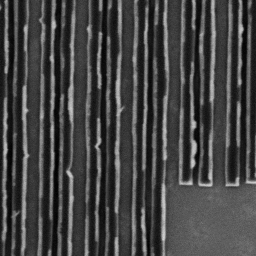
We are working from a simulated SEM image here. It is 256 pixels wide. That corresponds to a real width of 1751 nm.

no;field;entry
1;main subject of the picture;parallel lines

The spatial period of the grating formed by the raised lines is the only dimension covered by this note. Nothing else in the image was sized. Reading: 161 nanometres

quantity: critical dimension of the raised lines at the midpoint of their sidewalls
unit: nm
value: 88.9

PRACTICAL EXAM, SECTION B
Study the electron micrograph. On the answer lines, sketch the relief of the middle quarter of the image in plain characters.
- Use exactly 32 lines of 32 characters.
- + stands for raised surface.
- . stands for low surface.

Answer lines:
++....+++..+++...++++.++++....++
++....+++..+++....+++..+++....++
++....+++..+++....+++..+++...+++
++....+++..+++...++++..+++...+++
++....+++..+++....+++..+++...+++
++....+++..+++....+++..+++...+++
++....+++..+++....+++..+++...+++
++....+++..+++....+++..+++...+++
++....+++..+++....+++..+++...+++
++....+++..+++....+++.+++....+++
++....+++..+++....+++.+++....+++
++....+++..+++....+++..++....+++
++....+++..+++...+++...++....+++
++....+++..+++...+++...++....+++
++....+++..+++...+++...++....+++
++....+++..+++...+++..+++....+++
++....+++..+++...+++..++++...+++
++....+++..+++...+++..++++...+++
++....+++..+++...+++..++++...+++
++....+++..+++...+++..++++...+++
++....+++..++.....++..++++...+++
++....+++..+++....++...+++...+++
++....+++..+++....++..++++...+++
++....+++..+++....++..++++...+++
++....+++..+++....++..+++....+++
++....+++..+++...+++..+++....+++
+.....+++..+++...+++..+++....+++
++....+++..+++...+++..+++....+++
++....+++..+++...+++..+++....+++
++....+++..+++...+++..+++....+++
++....+++..+++...+++..+++.......
++....+++..++....+++..+++.......